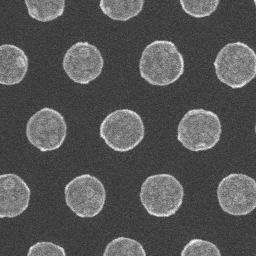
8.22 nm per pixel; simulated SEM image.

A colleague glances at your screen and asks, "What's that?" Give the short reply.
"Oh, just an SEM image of raised bodies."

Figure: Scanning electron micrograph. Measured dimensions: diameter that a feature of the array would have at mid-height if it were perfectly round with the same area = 41.8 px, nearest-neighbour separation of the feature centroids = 619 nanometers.